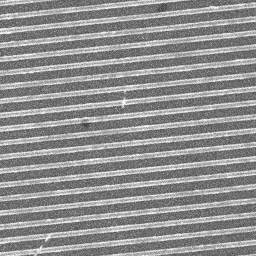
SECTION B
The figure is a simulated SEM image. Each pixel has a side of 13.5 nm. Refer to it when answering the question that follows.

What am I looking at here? parallel lines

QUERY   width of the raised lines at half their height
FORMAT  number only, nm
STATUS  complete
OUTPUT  58.9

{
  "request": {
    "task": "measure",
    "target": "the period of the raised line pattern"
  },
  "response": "188 nm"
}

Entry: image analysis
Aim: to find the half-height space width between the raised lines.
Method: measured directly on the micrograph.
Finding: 0.126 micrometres